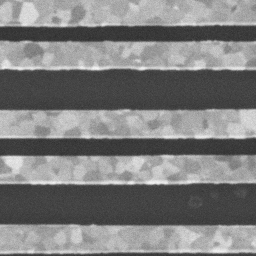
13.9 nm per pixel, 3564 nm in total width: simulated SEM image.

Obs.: lines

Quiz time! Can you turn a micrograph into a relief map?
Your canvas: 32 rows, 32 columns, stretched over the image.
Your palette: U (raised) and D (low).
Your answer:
UUUUUUUUUUUUUUUUUUUUUUUUUUUUUUUU
UUUUUUUUUUUUUUUUUUUUUUUUUUUUUUUU
UUUUUUUUUUUUUUUUUUUUUUUUUUUUUUUU
DDDDDDDDDDDDDDDDDDDDDDDDDDDDDDDD
DDDDDDDDDDDDDDDDDDDDDDDDDDDDDDDD
UUUUUUUUUUUUUUUUUUUUUUUUUUUUUUUU
UUUUUUUUUUUUUUUUUUUUUUUUUUUUUUUU
UUUUUUUUUUUUUUUUUUUUUUUUUUUUUUUU
DDDDDDDDDDDDDDDDDDDDDUDDDDDDDDUD
DDDDDDDDDDDDDDDDDDDDDDDDDDDDDDDD
DDDDDDDDDDDDDDDDDDDDDDDDDDDDDDDD
DDDDDDDDDDDDDDDDDDDDDDDDDDDDDDDD
DDDDDDDDDDDDDDDDDDDDDDDDDDDDDDDD
DDDDDDDDDDDDDDDDDDDDDDDDDDDDDDDD
UUUUUUUUUUUUUUUUUUUUUUUUUUUUUUUU
UUUUUUUUUUUUUUUUUUUUUUUUUUUUUUUU
UUUUUUUUUUUUUUUUUUUUUUUUUUUUUUUU
DDDDDDDDDDDDDDDDDDDDDDDDDDDDDDDD
DDDDDDDDDDDDDDDDDDDDDDDDDDDDDDDD
DDDDDDDDDDDDDDDDDDDDDDDDDDDDDDDD
UUUUUUUUUUUUUUUUUUUUUUUUUUUUUUUU
UUUUUUUUUUUUUUUUUUUUUUUUUUUUUUUU
UUUUUUUUUUUUUUUUUUUUUUUUUUUUUUUU
DDDDDDDDDDDDDDDDDDDDDDDDDDDDDDDD
DDDDDDDDDDDDDDDDDDDDDDDDDDDDDDDD
DDDDDDDDDDDDDDDDDDDDDDDDDDDDDDDD
DDDDDDDDDDDDDDDDDDDDDDDDDDDDDDDD
DDDDDDDDDDDDDDDDDDDDDDDDDDDDDDDD
UUUUUUUUUUUUUUUUUUUUUUUUUUUUUUUU
UUUUUUUUUUUUUUUUUUUUUUUUUUUUUUUU
UUUUUUUUUUUUUUUUUUUUUUUUUUUUUUUU
UUUUUUUDDUUDDDDDDDDDDDDDDDDDDDDD